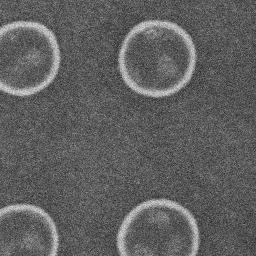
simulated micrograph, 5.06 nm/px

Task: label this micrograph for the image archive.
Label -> raised bodies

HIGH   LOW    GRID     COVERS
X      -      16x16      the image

----------------
----------------
XXX-----XXXX----
XXXX----XXXX----
XXX-----XXXX----
XX------XXX-----
----------------
----------------
----------------
----------------
----------------
----------------
----------------
XXX-----XXXX----
XXX-----XXXX----
XXX-----XXXX----